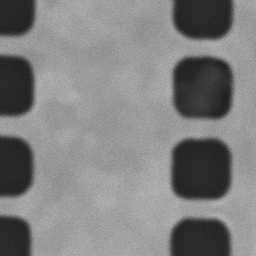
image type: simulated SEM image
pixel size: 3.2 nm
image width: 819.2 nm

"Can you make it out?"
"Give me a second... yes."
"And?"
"holes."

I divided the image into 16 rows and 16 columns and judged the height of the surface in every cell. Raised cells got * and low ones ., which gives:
..*********....*
..*********...**
****************
.***********.***
..*********...**
..*********....*
..*********...**
****************
.***************
..*********...**
..*********...**
..*********...**
****************
.***************
..*********...**
..*********...**